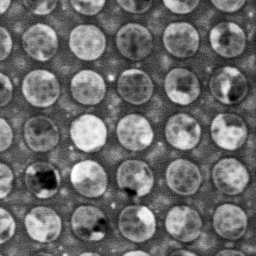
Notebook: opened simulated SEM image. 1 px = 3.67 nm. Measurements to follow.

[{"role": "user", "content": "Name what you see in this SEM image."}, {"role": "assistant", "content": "a regular array of raised bodies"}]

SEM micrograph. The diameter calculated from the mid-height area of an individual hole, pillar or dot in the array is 125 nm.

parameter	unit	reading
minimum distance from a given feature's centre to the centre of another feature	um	0.166